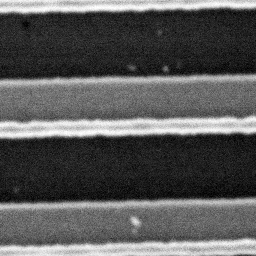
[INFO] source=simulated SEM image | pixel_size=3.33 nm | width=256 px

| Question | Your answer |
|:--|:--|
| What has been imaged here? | lines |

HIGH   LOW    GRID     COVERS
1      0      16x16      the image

1111111111100000
0000000000000000
0000000000000000
0000000000000000
0000000000000000
1111111111111111
1111111111111111
1111111111111111
1100000000000000
0000000000000000
0000000000000000
0000000000000000
0000000000000001
1111111111111111
1111111111111111
1111111111111111